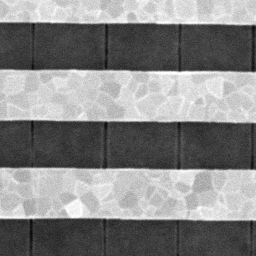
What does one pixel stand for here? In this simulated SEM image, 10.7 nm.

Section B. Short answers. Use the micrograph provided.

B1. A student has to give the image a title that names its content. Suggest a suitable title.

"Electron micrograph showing wiring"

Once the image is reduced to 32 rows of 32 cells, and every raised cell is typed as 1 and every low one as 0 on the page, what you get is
11111111111111111111111111111111
11111111111111111111111111111111
11111111111111111111111111111111
00000000000000000000000000000000
00000000000000000000000000000000
00000000000000000000000000000000
00000000000000000000000000000000
00000000000000000000000000000000
00000000000000000000000000000000
11111111111111111111111111111111
11111111111111111111111111111111
11111111111111111111111111111111
11111111111111111111111111111111
11111111111111111111111111111111
11111111111111111111111111111111
00000000000000000000000000000000
00000000000000000000000000000000
00000000000000000000000000000000
00000000000000000000000000000000
00000000000000000000000000000000
00000000000000000000000000000000
11111111111111111111111111111111
11111111111111111111111111111111
11111111111111111111111111111111
11111111111111111111111111111111
11111111111111111111111111111111
11111111111111111111111111111111
00000000000000000000000000000000
00000000000000000000000000000000
00000000000000000000000000000000
00000000000000000000000000000000
00000000000000000000000000000000